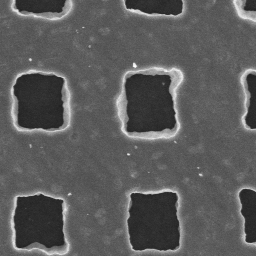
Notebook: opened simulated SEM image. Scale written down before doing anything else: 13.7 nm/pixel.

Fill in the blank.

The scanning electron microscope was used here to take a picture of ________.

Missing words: holes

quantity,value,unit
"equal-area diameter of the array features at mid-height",0.8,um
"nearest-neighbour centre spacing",1530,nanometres